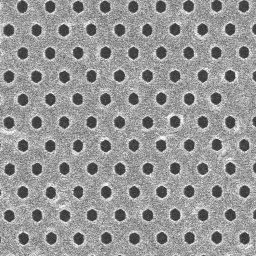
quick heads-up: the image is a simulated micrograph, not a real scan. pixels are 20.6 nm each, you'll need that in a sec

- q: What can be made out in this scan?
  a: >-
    a regular array of holes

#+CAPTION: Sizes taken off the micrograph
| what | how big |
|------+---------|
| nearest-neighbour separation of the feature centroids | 26.7 px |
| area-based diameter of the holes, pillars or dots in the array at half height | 239 nm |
